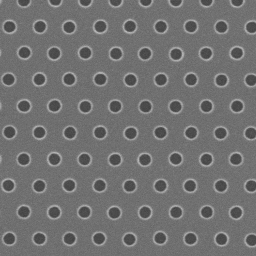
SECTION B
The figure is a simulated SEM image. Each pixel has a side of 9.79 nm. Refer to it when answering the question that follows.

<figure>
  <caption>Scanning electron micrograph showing a regular array of holes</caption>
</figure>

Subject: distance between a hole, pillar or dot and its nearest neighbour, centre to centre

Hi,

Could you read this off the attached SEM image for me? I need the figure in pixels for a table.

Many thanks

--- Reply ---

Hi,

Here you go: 29.9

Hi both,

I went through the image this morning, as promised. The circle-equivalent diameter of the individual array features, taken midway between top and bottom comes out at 12.2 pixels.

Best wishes